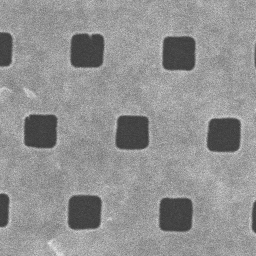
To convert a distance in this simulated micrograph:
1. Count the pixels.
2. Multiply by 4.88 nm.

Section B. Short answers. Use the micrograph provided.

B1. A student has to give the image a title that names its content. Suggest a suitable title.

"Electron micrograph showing holes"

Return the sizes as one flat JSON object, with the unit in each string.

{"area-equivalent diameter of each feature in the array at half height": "179 nm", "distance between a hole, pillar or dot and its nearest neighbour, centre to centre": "0.448 micrometres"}